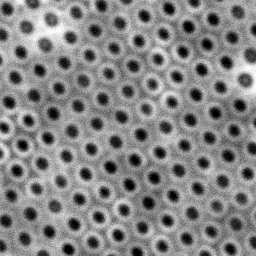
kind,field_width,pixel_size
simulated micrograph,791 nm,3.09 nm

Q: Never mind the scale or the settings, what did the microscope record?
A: a regular array of holes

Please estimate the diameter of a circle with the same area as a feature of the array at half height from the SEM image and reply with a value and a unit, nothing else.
44.5 nm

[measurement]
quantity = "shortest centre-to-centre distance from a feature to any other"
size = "0.079 micrometres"